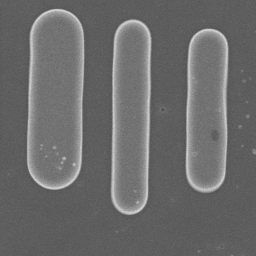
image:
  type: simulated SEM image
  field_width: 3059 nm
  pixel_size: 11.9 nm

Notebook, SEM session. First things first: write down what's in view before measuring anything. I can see groups of lines, slits or small figures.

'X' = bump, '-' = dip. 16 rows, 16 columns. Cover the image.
----------------
--XXX---X-------
--XXX--XX---XX--
--XXX--XX---XX--
--XXX--XX---XX--
--XXX--XX---XX--
--XXX--XX---XX--
--XXX--XX---XX--
--XXX--XX---XX--
--XXX--XX---XX--
--XXX--XX---XX--
---X---XX---XX--
-------XX-------
----------------
----------------
----------------